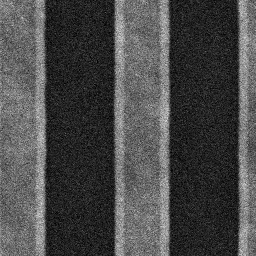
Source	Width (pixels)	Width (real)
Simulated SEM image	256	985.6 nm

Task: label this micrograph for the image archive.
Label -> one or a few lines or trenches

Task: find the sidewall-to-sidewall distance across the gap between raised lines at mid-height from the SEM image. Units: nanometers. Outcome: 308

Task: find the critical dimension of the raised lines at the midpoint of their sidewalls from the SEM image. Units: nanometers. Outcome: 169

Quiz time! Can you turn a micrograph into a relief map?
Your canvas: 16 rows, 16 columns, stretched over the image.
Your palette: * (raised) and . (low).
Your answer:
**......**.....*
***.....**.....*
**......**.....*
***.....**.....*
***.....**.....*
**......**.....*
**......**.....*
***.....**.....*
***.....**.....*
***.....**.....*
***.....**.....*
**......**.....*
***.....**.....*
***.....**.....*
**......**.....*
**......**.....*